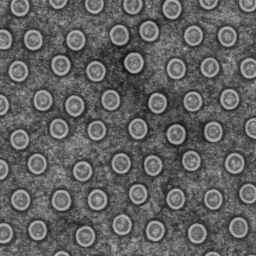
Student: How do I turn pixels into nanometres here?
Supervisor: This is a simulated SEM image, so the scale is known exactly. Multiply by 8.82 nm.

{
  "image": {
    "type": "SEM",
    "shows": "a regular array of raised bodies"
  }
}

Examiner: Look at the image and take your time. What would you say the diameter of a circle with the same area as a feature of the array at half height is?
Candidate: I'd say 17.9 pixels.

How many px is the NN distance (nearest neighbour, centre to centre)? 32.8